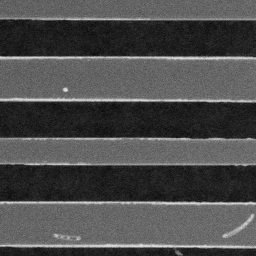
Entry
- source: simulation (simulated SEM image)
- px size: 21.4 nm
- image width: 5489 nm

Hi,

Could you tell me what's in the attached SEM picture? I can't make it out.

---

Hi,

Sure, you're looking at lines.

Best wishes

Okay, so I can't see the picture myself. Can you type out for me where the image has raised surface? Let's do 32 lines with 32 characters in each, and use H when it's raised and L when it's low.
HHHHHHHHHHHHHHHHHHHHHHHHHHHHHHHH
HHHHHHHHHHHHHHHHHHHHHHHHHHHHHHHH
LLLLLLLLLLLLLLLLLLLLLLLLLLLLLLLL
LLLLLLLLLLLLLLLLLLLLLLLLLLLLLLLL
LLLLLLLLLLLLLLLLLLLLLLLLLLLLLLLL
LLLLLLLLLLLLLLLLLLLLLLLLLLLLLLLL
LLLLLLLLLLLLLLLLLLLLLLLLLLLLLLLL
HHHHHHHHHHHHHHHHHHHHHHHHHHHHHHHH
HHHHHHHHHHHHHHHHHHHHHHHHHHHHHHHH
HHHHHHHHHHHHHHHHHHHHHHHHHHHHHHHH
HHHHHHHHHHHHHHHHHHHHHHHHHHHHHHHH
HHHHHHHHHHHHHHHHHHHHHHHHHHHHHHHH
HHHHHHHHHHHHHHHHHHHHHHHHHHHHHHHH
LLLLLLLLLLLLLLLLLLLLLLLLLLLLLLLL
LLLLLLLLLLLLLLLLLLLLLLLLLLLLLLLL
LLLLLLLLLLLLLLLLLLLLLLLLLLLLLLLL
LLLLLLLLLLLLLLLLLLLLLLLLLLLLLLLL
HHHHHHHHHHHHHHHHHHHHHHHHHHHHHHHH
HHHHHHHHHHHHHHHHHHHHHHHHHHHHHHHH
HHHHHHHHHHHHHHHHHHHHHHHHHHHHHHHH
LHLHHHHHHHHHHHHHHHHHHHHHHHHHHHHH
LLLLLLLLLLLLLLLLLLLLLLLLLLLLLLLL
LLLLLLLLLLLLLLLLLLLLLLLLLLLLLLLL
LLLLLLLLLLLLLLLLLLLLLLLLLLLLLLLL
LLLLLLLLLLLLLLLLLLLLLLLLLLLLLLLL
HHHHHHHHHHHHHHHHHHHHHHHHHHHHHHHH
HHHHHHHHHHHHHHHHHHHHHHHHHHHHHHHH
HHHHHHHHHHHHHHHHHHHHHHHHHHHHHHHH
HHHHHHHHHHHHHHHHHHHHHHHHHHHHHHHH
HHHHHHHHHHHHHHHHHHHHHHHHHHHHHHHH
HHHHHHHHHHHHHHHHHHHHHHHHHHHHHHHH
LLLLLLLLLLLLLLLLLLLLLLLLLLLLLLLL